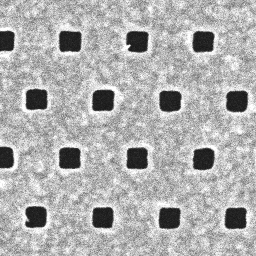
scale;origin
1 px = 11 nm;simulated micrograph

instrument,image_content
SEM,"a regular array of holes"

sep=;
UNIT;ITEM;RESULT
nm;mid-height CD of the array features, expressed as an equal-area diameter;259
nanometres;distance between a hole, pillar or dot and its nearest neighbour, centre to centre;730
